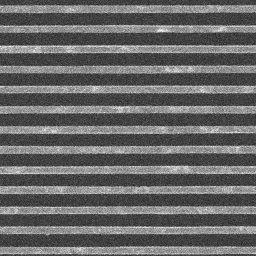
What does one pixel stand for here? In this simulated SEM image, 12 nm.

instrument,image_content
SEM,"parallel lines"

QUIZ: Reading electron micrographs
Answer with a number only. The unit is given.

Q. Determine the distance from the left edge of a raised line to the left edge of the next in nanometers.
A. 242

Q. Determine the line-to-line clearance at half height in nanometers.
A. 161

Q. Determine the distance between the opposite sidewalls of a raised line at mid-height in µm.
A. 0.0796